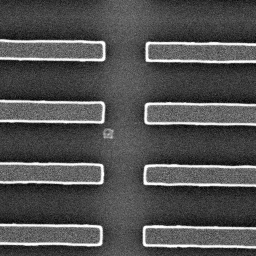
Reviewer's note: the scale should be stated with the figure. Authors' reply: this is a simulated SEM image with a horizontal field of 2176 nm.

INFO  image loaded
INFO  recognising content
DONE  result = groups of lines, slits or small figures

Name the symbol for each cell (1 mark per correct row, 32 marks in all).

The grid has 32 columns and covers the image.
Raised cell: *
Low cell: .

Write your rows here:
................................
................................
................................
................................
................................
*************......*****........
*************.....**************
...........**......*************
................................
................................
................................
................................
................................
*************.....**************
*************.....**************
.........................*******
................................
................................
................................
................................
****............................
*************.....**************
*************.....**************
................................
................................
................................
................................
................................
************......*********.....
*************.....**************
........****......**************
................................